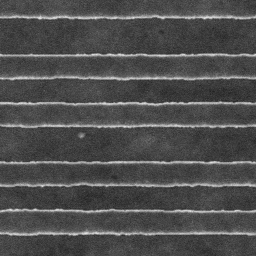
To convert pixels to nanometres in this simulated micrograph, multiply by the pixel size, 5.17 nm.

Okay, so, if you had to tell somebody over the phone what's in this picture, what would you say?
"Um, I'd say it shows lines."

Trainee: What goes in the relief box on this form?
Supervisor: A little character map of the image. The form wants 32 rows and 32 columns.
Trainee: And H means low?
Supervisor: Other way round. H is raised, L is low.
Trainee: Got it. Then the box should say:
HHHHHHHHHHHHHHHHHHHHHHHHHHHHHHHH
HHHHHHHHHHHHHHHHHHHHHHHHHHHHHHHH
LLLLLLLLLLLLLLLLLLLLLLLLLLLLLLLL
LLLLLLLLLLLLLLLLLLLLLLLLLLLLLLLL
LLLLLLLLLLLLLLLLLLLLLLLLLLLLLLLL
LLLLLLLLLLLLLLLLLLLLLLLLLLLLLLLL
LLLLLLLLLLLLLLLLLLLLLLLLLLLLLLLL
HHHHHHHHHHHHHHHHHHHHHHHHHHHHHHHH
HHHHHHHHHHHHHHHHHHHHHHHHHHHHHHHH
HHHHHHHHHHHHHHHHHHHHHHHHHHHHHHHH
LLLLLLLLLLLLLLLLLLLLLLLLLLLLLLLL
LLLLLLLLLLLLLLLLLLLLLLLLLLLLLLLL
LLLLLLLLLLLLLLLLLLLLLLLLLLLLLLLL
HHHHHHHHHHHHHHHHHHHHHHHHHHHHHHHH
HHHHHHHHHHHHHHHHHHHHHHHHHHHHHHHH
HHHHHHHHHHHHHHHHHHHHHHHHHHHHHHHH
LLLLLLLLLLLLLLLLLLLLLLLLLLLLLLLL
LLLLLLLLLLLLLLLLLLLLLLLLLLLLLLLL
LLLLLLLLLLLLLLLLLLLLLLLLLLLLLLLL
LLLLLLLLLLLLLLLLLLLLLLLLLLLLLLLL
HHHHHHHHHHHHHHHHHHHHHHHHHHHHHHHH
HHHHHHHHHHHHHHHHHHHHHHHHHHHHHHHH
HHHHHHHHHHHHHHHHHHHHHHHHHHHHHHHH
LLLLLLLLLLLLLLLLLLLLLLLLLLLLLLLL
LLLLLLLLLLLLLLLLLLLLLLLLLLLLLLLL
LLLLLLLLLLLLLLLLLLLLLLLLLLLLLLLL
HHHHHHHHHHHHHHHHHHHHHHHHHHHHHHHH
HHHHHHHHHHHHHHHHHHHHHHHHHHHHHHHH
HHHHHHHHHHHHHHHHHHHHHHHHHHHHHHHH
LLLLLLLLLLLLLLLLLLLLLLLLLLLLLLLL
LLLLLLLLLLLLLLLLLLLLLLLLLLLLLLLL
LLLLLLLLLLLLLLLLLLLLLLLLLLLLLLLL